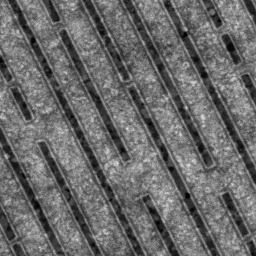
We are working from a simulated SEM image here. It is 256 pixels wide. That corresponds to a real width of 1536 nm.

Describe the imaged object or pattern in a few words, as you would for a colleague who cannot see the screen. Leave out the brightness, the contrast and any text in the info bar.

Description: parallel lines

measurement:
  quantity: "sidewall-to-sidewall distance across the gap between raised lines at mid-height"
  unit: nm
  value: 158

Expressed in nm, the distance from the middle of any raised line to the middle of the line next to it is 209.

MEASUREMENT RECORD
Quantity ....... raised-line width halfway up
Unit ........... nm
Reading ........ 56.2